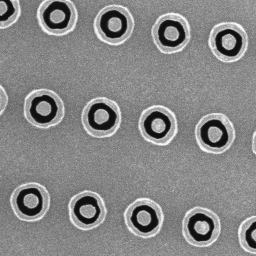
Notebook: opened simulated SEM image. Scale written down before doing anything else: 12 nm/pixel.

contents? a regular array of ring-shaped raised bodies with a dot in the middle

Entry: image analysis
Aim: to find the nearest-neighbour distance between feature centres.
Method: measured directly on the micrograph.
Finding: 693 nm